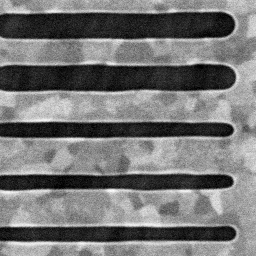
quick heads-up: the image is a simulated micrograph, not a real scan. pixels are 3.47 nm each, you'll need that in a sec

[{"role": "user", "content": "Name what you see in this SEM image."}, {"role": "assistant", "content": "groups of lines, slits or small figures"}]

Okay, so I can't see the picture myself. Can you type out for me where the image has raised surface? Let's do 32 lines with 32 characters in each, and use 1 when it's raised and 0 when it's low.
11111111111111111111111111111111
11111111111001111111100000001111
00000000000000000000000000000111
00000000000000000000000000000111
00000000000000000000000000000111
11111111111111111111111111111111
11111111111111111111111111111111
11111111111111111111111111111111
00000000000000000000000000000111
00000000000000000000000000000011
00000000000000000000000000000111
10000111110000011111111111111111
11111111111111111111111111111111
11111111111111111111111111111111
11111111111111111111111111111111
00000000000000000000000000000111
00000000000000000000000000000111
11111111111111111111111111111111
11111111111111111111111111111111
11111111111111111111111111111111
11111111111111111111111111111111
11111111111111111111111111111111
00000000000000000000000000000111
00000000000000000000000000000111
11111111111111111111111111111111
11111111111111111111111111111111
11111111111111111111111111111111
11111111111111111111111111111111
00000000000000000000000000000111
00000000000000000000000000000011
11111111111111111111111111111111
11111111111111111111111111111111